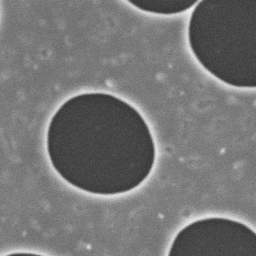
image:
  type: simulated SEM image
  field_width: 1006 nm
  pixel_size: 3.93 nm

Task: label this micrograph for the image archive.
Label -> holes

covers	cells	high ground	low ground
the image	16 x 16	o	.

ooooooooo.......
oooooooooooo....
oooooooooooo....
oooooooooooo....
ooooooooooooo...
oooooooooooooooo
oooo....oooooooo
ooo......ooooooo
ooo......ooooooo
ooo.......oooooo
ooo......ooooooo
oooo.....ooooooo
oooooooooooooooo
oooooooooooooooo
ooooooooooo.....
ooooooooooo.....